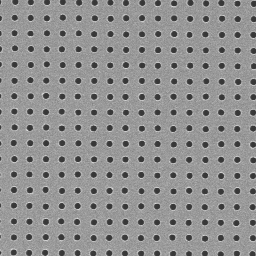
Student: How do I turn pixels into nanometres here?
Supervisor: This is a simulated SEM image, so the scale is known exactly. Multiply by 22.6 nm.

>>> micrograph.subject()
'a regular array of holes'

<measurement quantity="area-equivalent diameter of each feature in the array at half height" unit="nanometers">140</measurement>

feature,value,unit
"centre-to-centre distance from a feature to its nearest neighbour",348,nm